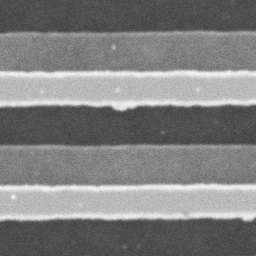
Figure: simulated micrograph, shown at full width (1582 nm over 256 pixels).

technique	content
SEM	lines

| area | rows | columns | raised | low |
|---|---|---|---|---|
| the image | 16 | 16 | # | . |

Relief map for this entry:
................
................
################
################
################
################
################
................
................
################
################
################
################
################
................
................